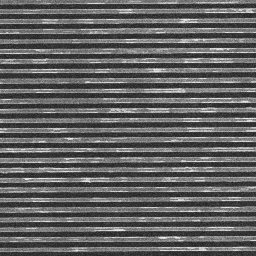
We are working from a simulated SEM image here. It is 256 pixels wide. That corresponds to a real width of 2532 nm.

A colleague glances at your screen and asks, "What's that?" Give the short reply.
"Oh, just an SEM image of parallel lines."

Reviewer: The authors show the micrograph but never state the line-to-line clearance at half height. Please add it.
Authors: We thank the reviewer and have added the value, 0.0569 micrometres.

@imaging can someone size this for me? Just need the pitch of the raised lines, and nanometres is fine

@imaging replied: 98.1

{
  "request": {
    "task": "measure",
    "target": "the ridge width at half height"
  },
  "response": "0.0383 um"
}